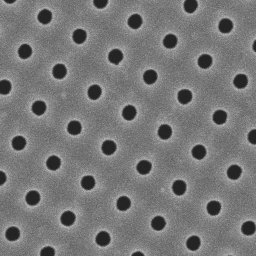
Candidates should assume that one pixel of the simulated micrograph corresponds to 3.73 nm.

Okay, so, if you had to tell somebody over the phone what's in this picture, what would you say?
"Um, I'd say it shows a regular array of holes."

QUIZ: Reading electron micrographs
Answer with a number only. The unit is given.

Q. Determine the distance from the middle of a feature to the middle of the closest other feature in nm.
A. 150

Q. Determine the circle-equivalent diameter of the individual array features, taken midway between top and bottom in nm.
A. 56.3